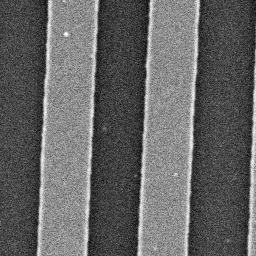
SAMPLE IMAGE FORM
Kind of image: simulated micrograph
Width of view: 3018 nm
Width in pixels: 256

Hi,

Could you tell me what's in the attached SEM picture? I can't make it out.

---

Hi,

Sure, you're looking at lines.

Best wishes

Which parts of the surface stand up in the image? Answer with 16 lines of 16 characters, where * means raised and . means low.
...***...***....
...***...***....
...***...***....
...***...***....
...***...***....
...***...***....
...***...***....
...***...***....
...***...***....
...***...***....
...***...***....
...***...***....
..****...***....
..****...***....
..***....***....
..***....***....